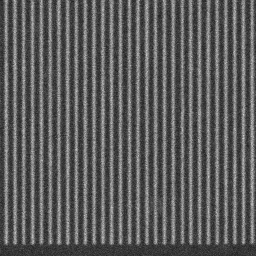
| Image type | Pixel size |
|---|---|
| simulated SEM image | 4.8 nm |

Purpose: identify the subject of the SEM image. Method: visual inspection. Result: parallel lines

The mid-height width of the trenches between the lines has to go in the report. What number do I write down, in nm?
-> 31.8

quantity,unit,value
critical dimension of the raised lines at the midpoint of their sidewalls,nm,12.6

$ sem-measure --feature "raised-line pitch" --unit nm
42.2